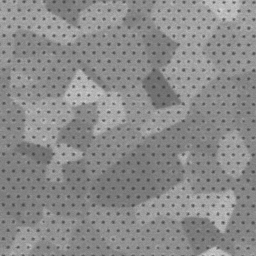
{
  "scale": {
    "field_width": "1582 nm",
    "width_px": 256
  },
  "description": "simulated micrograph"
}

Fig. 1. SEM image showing a regular array of holes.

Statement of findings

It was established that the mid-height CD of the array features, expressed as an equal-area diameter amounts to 20.9 nanometres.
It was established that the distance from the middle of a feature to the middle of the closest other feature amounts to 58.3 nanometers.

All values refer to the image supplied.